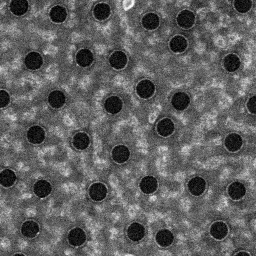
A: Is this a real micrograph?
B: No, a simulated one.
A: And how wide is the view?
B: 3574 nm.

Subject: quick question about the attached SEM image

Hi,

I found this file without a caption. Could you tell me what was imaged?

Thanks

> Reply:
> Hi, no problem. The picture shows a regular array of raised bodies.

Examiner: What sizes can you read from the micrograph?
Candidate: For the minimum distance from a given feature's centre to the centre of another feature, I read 573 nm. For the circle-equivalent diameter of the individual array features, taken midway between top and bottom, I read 276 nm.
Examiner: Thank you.